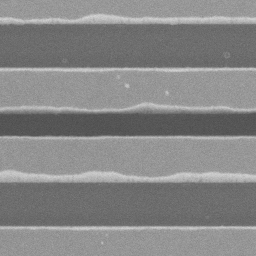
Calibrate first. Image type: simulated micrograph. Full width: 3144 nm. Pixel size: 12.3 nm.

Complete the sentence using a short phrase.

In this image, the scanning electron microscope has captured lines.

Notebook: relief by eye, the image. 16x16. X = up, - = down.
XXXXXXXXXXXXXXXX
----------------
----------------
----------------
XXXXXXXXXXXXXXXX
XXXXXXXXXXXXXXXX
XXXXXXXXXXXXXXXX
----------------
----------------
XXXXXXXXXXXXXXXX
XXXXXXXXXXXXXXXX
----------------
----------------
----------------
XXXXXXXXXXXXXXXX
XXXXXXXXXXXXXXXX